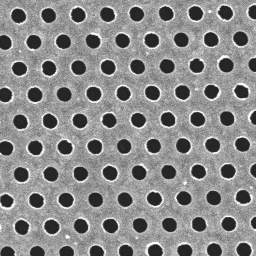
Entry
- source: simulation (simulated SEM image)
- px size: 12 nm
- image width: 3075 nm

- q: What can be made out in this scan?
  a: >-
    a regular array of holes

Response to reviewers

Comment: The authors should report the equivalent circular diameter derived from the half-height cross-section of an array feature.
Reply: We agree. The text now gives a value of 176 nm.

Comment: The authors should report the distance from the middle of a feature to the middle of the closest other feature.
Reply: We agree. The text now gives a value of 0.353 micrometres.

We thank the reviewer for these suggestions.